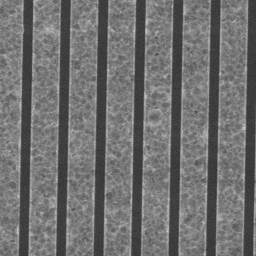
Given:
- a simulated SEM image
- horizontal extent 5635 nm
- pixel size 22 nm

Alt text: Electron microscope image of parallel lines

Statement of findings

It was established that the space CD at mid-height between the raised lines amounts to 0.231 microns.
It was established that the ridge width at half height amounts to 591 nanometres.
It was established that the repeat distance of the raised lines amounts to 0.82 micrometres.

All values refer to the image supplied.